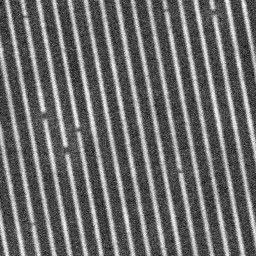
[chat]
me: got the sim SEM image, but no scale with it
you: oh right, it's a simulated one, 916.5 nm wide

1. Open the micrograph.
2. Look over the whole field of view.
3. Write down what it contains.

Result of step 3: parallel lines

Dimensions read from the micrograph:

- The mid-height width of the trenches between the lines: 41.8 nanometres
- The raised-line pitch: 0.0554 microns